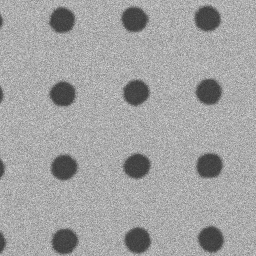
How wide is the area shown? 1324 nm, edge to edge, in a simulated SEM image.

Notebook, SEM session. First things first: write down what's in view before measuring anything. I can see a regular array of holes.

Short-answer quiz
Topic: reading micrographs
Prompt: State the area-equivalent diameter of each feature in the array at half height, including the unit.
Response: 25.3 px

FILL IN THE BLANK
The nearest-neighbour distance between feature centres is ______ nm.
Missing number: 376